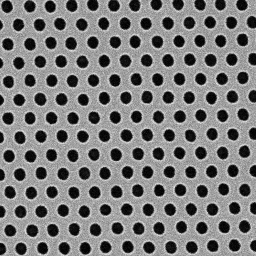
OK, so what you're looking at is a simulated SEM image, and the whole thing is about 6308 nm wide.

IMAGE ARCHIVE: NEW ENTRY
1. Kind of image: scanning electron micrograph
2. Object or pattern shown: a regular array of holes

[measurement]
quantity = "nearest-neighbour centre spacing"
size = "510 nm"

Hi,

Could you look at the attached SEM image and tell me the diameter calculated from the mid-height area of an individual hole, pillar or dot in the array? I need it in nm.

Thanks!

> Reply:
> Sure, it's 311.